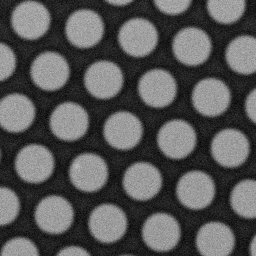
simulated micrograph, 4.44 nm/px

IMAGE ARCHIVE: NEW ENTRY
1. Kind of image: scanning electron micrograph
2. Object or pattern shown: an array of small figures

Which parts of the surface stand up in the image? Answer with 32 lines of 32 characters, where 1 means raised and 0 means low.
00011000000000110001111100111110
00111100001100000000111000111100
01111100011110001100000000011100
00111100111110011110000000000000
00011000111110011111001111000000
00000000011100011111001111000111
11000000000000001110001111001111
11001111000000000000001111001111
11001111100111100000000000000111
10001111100111100011100000000000
00000111000111100111110001110000
00000000000111100111110011111001
11110000000000000011110011111001
11110001110000000000000011110001
11110011111000111000000000100001
11110011111001111100011000000000
00000001111001111100111100001100
00000000100001111000111100011110
00011100000000110000111100111110
00111100001100000000011000011110
00111110011110000110000000001100
00111100011110001111000010000000
00011100011110011111000111000000
10000000001110001111001111100111
11000000000000001110001111100111
11000111100000000000000111000111
11001111100011100000000000000011
11001111100111110011110000000000
00000111000111110011110001111000
00000000000011100011110001111000
01110000000000000011110001111001
11111001111000000000000001111001